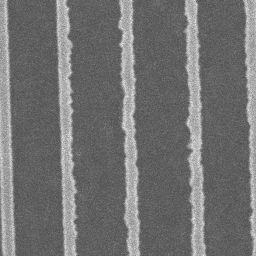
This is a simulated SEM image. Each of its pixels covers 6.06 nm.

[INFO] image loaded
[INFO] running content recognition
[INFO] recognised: one or a few lines or trenches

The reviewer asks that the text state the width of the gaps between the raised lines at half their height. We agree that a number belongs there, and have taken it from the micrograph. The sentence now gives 307 nanometres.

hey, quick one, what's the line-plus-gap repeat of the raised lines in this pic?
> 0.389 microns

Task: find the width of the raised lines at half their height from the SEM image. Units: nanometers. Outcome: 66.6